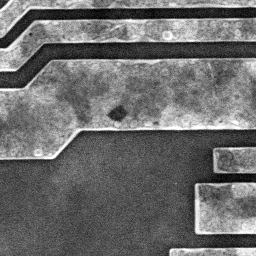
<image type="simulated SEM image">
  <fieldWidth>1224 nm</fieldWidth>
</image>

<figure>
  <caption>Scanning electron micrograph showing groups of lines, slits or small figures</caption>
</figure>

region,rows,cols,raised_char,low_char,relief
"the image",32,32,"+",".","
.+++++++++++++++++++++++++++++++
+++.............................
++......................++++++++
+...++++++++++++++++++++++++++++
...+++++++++++++++++++++++++++++
..++++..........................
++++............................
+++.................++++++++++++
++...+++++++++++++++++++++++++++
.....+++++++++++++++++++++++++++
....++++++++++++++++++++++++++++
++++++++++++++++++++++++++++++++
++++++++++++++++++++++++++++++++
++++++++++++++++++++++++++++++++
++++++++++++++++++++++++++++++++
++++++++++++++++++++++++++++++++
++++++++++......................
+++++++++.......................
++++++++.......................+
+++++++....................+++++
...........................+++++
............................++++
................................
.........................+++++++
.........................+++++++
.........................+++++++
.........................+++++++
.........................+++++++
.........................+++++++
................................
................................
.....................+++++++++++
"